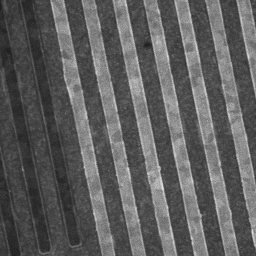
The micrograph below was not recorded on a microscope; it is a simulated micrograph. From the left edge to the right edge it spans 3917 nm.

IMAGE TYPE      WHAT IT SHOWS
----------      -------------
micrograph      parallel lines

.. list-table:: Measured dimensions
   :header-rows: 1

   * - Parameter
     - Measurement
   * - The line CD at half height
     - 191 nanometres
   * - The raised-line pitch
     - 0.464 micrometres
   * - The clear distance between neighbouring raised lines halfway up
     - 0.279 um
